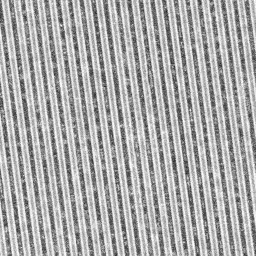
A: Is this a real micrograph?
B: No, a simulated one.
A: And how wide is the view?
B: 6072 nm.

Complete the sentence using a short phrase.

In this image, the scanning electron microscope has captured parallel lines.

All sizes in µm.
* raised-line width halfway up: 0.126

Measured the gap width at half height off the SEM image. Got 150 nm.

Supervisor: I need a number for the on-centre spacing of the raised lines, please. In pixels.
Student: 11.7